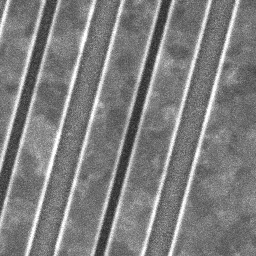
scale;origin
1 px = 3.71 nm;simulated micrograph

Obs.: parallel lines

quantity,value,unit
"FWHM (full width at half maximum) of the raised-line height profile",0.135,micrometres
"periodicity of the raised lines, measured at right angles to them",202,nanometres